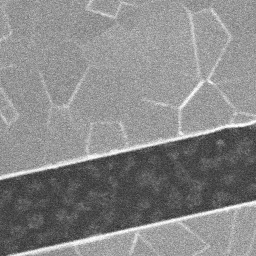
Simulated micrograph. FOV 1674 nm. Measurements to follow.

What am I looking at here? one or a few lines or trenches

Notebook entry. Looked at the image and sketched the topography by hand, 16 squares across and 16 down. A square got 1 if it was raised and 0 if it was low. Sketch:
1111111111111111
1111111111111111
1111111111111111
1111111111111111
1111111111111111
1111111111111111
1111111111111111
1111111111111111
1111111111110000
1111111000000000
1110000000000000
0000000000000000
0000000000000000
0000000000001111
0000000111111111
0001111111111111